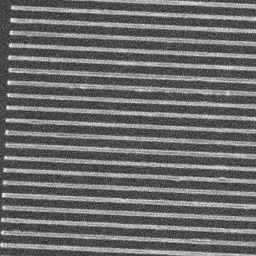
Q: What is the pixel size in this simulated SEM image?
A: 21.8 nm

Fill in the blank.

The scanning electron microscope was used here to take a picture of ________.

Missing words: parallel lines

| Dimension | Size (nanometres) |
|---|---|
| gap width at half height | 204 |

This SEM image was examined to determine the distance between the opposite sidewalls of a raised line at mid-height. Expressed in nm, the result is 73.3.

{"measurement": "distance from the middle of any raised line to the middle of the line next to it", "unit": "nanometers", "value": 272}